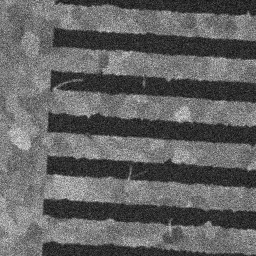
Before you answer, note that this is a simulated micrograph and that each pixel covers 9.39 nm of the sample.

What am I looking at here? parallel lines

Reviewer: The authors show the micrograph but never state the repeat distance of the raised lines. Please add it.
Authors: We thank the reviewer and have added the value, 400 nm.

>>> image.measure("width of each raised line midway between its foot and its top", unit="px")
23.2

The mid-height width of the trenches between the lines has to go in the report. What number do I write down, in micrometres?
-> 0.183